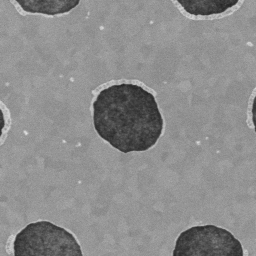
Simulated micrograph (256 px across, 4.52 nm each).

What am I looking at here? holes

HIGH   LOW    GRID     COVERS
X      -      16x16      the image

X----XXXXXX---XX
XXXXXXXXXXXXXXXX
XXXXXXXXXXXXXXXX
XXXXXXXXXXXXXXXX
XXXXXXXXXXXXXXXX
XXXXXXX--XXXXXXX
XXXXXX----XXXXXX
XXXXXX----XXXXXX
XXXXXX----XXXXXX
XXXXXXXXXXXXXXXX
XXXXXXXXXXXXXXXX
XXXXXXXXXXXXXXXX
XXXXXXXXXXXXXXXX
XXXXXXXXXXXXXXXX
X---XXXXXXX---XX
X----XXXXXX----X